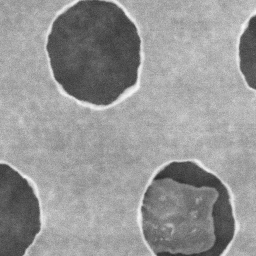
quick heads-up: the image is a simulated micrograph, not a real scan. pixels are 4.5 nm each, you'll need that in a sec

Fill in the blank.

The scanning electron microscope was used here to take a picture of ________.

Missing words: holes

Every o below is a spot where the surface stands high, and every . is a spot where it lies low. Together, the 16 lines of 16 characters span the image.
oooo....oooooooo
ooo.....ooooooo.
ooo......oooooo.
ooo......oooooo.
ooo......oooooo.
oooo....oooooooo
oooooo.ooooooooo
oooooooooooooooo
oooooooooooooooo
oooooooooooooooo
.ooooooooo...ooo
..ooooooo.....oo
..ooooooo.....oo
...oooooo......o
..ooooooo......o
..ooooooo.....oo